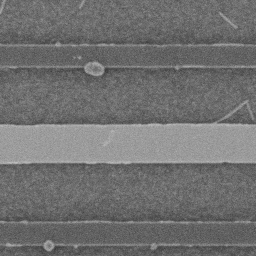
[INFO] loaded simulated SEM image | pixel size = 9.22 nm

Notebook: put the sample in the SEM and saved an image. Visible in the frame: lines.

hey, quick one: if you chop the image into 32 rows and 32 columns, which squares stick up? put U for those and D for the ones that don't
DDDDDDDDDDDDDDDDDDDDDDDDDDDDDDDD
DDDDDDDDDDDDDDDDDDDDDDDDDDDDDDDD
DDDDDDDDDDDDDDDDDDDDDDDDDDDDDDDD
DDDDDDDDDDDDDDDDDDDDDDDDDDDDDDDD
DDDDDDDDDDDDDDDDDDDDDDDDDDDDDDDD
DDDDDDDUDDDDDDDDDDDDDDDDDDDDDDDD
UUUUUUUUUUUUUUUUUUUUUUUUUUUUUUUU
UUUUUUUUUUUUUUUUUUUUUUUUUUUUUUUU
DDDDDDDDDDUUUDDDDDDDDDDDDDDDDDDD
DDDDDDDDDDDDDDDDDDDDDDDDDDDDDDDD
DDDDDDDDDDDDDDDDDDDDDDDDDDDDDDDD
DDDDDDDDDDDDDDDDDDDDDDDDDDDDDDDD
DDDDDDDDDDDDDDDDDDDDDDDDDDDDDDDD
DDDDDDDDDDDDDDDDDDDDDDDDDDDDDDDD
DDDDDDDDDDDDDDDDDDDDDDDDDDDDDDDD
DDDDDDDDDDDDDDDDDDDDDDDDDDUUDDDD
UUUUUUUUUUUUUUUUUUUUUUUUUUUUUUUU
UUUUUUUUUUUUUUUUUUUUUUUUUUUUUUUU
UUUUUUUUUUUUUUUUUUUUUUUUUUUUUUUU
UUUUUUUUUUUUUUUUUUUUUUUUUUUUUUUU
DDDDDDDDDDDDDDDDDDDDDDDDDDDDDDDD
DDDDDDDDDDDDDDDDDDDDDDDDDDDDDDDD
DDDDDDDDDDDDDDDDDDDDDDDDDDDDDDDD
DDDDDDDDDDDDDDDDDDDDDDDDDDDDDDDD
DDDDDDDDDDDDDDDDDDDDDDDDDDDDDDDD
DDDDDDDDDDDDDDDDDDDDDDDDDDDDDDDD
DDDDDDDDDDDDDDDDDDDDDDDDDDDDDDDD
DDDDDDDDDDDDDDDDDDDDDDDDDDDDDDDD
UUUUUUUUUUUUUUUUUUUUUUUUUUUUUUUU
UUUUUUUUUUUUUUUUUUUUUUUUUUUUUUUU
UUUUUUUUUUUUUUUUUUUUUUUUUUUUUUUU
DDDDDDDDDDDDDDDDDDDDDDDDDDDDDDDD